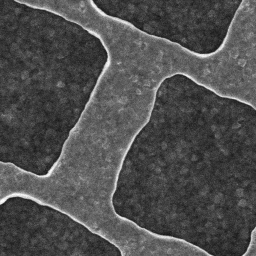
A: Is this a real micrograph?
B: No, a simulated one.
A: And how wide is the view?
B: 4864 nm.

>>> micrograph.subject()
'holes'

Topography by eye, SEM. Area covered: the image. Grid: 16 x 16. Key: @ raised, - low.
--@@@@---------@
-----@@@------@@
------@@@@----@@
-------@@@@@@@@@
------@@@@@@@@@@
------@@@@---@@@
-----@@@@@-----@
-----@@@@-------
----@@@@@-------
----@@@@--------
@--@@@@@--------
@@@@@@@---------
--@@@@@---------
----@@@@--------
------@@@-------
-------@@@@@---@